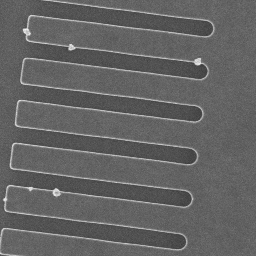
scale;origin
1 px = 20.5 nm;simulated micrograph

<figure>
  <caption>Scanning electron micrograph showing groups of lines, slits or small figures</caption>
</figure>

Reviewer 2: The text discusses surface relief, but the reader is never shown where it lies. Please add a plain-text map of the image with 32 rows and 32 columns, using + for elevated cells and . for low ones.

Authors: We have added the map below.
.........+++++++++++++++++++++++
.................+++++++++++++++
....++++.................+++++++
...+++++++++++++...........+++++
...++++++++++++++++++++++.++++++
......++++++++++++++++++++++++++
..............++++++++++++++++++
...+++................++++++++++
...+++++++++++............++++++
...++++++++++++++++++.....++++++
...+++++++++++++++++++++++++++++
...........+++++++++++++++++++++
...................+++++++++++++
..+++++++++..............+++++++
..++++++++++++++++.......+++++++
..++++++++++++++++++++++++++++++
.......+++++++++++++++++++++++++
...............+++++++++++++++++
..+++++................+++++++++
.++++++++++++++..........+++++++
.++++++++++++++++++++++.++++++++
.....+++++++++++++++++++++++++++
............++++++++++++++++++++
.+++................++++++++++++
.+++++++++++............++++++++
.+++++++++++++++++++....++++++++
.+++++++++++++++++++++++++++++++
.........+++++++++++++++++++++++
.................+++++++++++++++
+++++++++..............+++++++++
+++++++++++++++++......+++++++++
++++++++++++++++++++++++++++++++